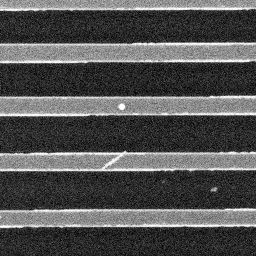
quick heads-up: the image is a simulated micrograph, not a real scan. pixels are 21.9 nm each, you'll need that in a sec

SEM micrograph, lines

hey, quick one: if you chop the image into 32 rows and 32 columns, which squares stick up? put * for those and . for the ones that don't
********************************
................................
................................
................................
................................
................****************
********************************
********************************
................................
................................
................................
................................
********************************
********************************
................................
................................
................................
................................
................................
********************************
********************************
................................
................................
................................
................................
................................
********************************
********************************
................................
................................
................................
................................